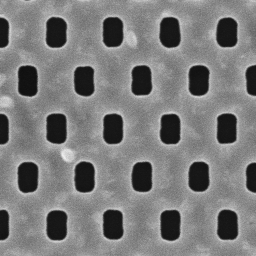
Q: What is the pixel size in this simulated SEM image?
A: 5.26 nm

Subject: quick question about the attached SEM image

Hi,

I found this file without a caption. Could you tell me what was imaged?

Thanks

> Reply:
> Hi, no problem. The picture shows a regular array of holes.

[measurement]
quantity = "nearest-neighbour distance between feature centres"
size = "292 nanometres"